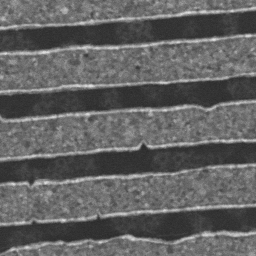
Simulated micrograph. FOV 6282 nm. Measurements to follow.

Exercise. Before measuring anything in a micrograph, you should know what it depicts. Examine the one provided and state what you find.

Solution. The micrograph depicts one or a few lines or trenches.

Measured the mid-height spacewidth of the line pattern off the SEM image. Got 0.658 um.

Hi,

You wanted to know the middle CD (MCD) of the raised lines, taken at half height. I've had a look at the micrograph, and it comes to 0.93 microns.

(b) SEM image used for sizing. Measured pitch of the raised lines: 65 px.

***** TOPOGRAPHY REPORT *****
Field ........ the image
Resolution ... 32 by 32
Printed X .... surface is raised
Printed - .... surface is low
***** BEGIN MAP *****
XXXXXXXXXXXXXXXXXXXXXXXXXXXXXXXX
XXXXXXXXXXXXXXXXXXXXXXXXXX------
XXXXXXXXXXXXXX------------------
X-------------------------------
-------------------------------X
-------------------XXXXXXXXXXXXX
------XXXXXXXXXXXXXXXXXXXXXXXXXX
XXXXXXXXXXXXXXXXXXXXXXXXXXXXXXXX
XXXXXXXXXXXXXXXXXXXXXXXXXXXXXXXX
XXXXXXXXXXXXXXXXXXXXXXXXXXXXX---
XXXXXXXXXXXXXXX-----------------
--------------------------------
--------------------------------
----------------------XXX--XXXXX
--------XXXXXXXXXXXXXXXXXXXXXXXX
XXXXXXXXXXXXXXXXXXXXXXXXXXXXXXXX
XXXXXXXXXXXXXXXXXXXXXXXXXXXXXXXX
XXXXXXXXXXXXXXXXXXXXXXXXXXXXXXXX
XXXXXXXXXXXXXXXXX---------------
XXXX----------------------------
--------------------------------
-----------------------XXXXXXXXX
----------XXXXXXXXXXXXXXXXXXXXXX
XXXXXXXXXXXXXXXXXXXXXXXXXXXXXXXX
XXXXXXXXXXXXXXXXXXXXXXXXXXXXXXXX
XXXXXXXXXXXXXXXXXXXXXXXXXXXXXXXX
XXXXXXXXXXXXXXXXX---------------
XXXX-XXX------------------------
--------------------------------
-------------------------XXXXXXX
------XX-XXXXXXXXXXXXXXXXXXXXXXX
-XXXXXXXXXXXXXXXXXXXXXXXXXXXXXXX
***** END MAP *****